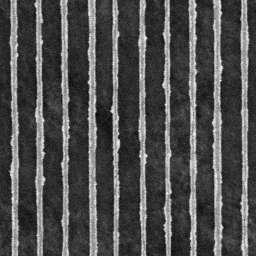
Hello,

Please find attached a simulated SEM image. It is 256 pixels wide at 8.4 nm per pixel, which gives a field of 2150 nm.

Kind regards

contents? parallel lines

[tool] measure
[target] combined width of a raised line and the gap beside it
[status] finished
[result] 25.6 pixels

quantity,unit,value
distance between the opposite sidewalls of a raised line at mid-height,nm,45.2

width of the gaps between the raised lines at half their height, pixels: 20